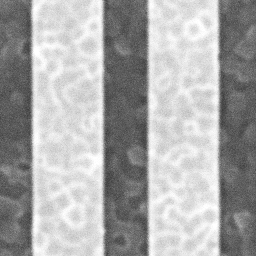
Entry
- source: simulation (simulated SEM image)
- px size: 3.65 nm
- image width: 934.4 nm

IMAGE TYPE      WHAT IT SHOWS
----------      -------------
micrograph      one or a few lines or trenches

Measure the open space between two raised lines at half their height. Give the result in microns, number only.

0.171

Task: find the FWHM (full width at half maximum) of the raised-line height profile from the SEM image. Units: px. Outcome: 68.9